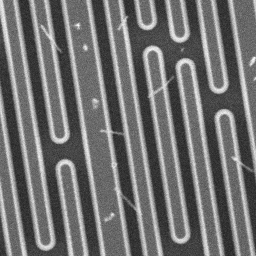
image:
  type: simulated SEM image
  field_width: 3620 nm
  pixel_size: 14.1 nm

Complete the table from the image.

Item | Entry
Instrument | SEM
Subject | groups of lines, slits or small figures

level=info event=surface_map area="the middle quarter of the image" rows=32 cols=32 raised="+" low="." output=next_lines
..+++++++....++++....++++....+++
..+++++++....++++....++++....+++
...++++++....++++....++++....+++
...++++++....++++....++++....+++
...++++++....++++....++++....+++
...+++++++....++++...++++....+++
...+++++++....++++....+++....+++
...+++++++....++++....++++...+++
....++++++....++++....++++....++
....++++++....++++....++++....++
....++++++....++++....++++....++
....+++++++....++++...++++....++
....+++++++....++++...++++....++
....+++++++....++++....++++...++
.....++++++....++++....++++...++
+....++++++....++++....++++....+
+....+++++++...++++....++++....+
+....+++++++...++++....++++....+
+....+++++++....++++...++++....+
.....+++++++....++++....++++...+
.....+++++++....++++....++++....
......++++++....++++....++++....
......++++++....++++....++++....
......++++++....++++....++++....
......+++++++....++++...++++....
++....+++++++....++++....++++...
++....+++++++....++++....++++...
++.....++++++....++++....++++...
+++....++++++....++++....++++...
+++....++++++....++++....++++...
+++....++++++.....++++...++++...
+++....+++++++....++++....+++...